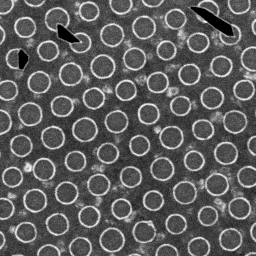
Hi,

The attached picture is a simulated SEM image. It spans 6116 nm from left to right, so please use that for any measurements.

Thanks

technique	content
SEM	a regular array of raised bodies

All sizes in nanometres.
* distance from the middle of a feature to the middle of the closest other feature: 778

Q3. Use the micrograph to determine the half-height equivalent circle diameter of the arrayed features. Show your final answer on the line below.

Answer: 498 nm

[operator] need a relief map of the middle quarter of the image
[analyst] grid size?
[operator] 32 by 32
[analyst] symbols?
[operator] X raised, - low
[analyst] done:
XXXX---XXXXXX---XXXX----------XX
XXXX---XXXXX-----------------XXX
XXXXX---XXXX----------XXX----XXX
XXXX-----------------XXXXX---XXX
XXXX----------XXX----XXXXX----XX
-------------XXXXX---XXXXX------
------XXX----XXXXX----XXX--X----
-----XXXXX---XXXXX--------------
X----XXXXX----XXX-----------XXX-
XX---XXXXX-----------------XXXX-
XX----XXX-----------XXX----XXXXX
XX-----------------XXXX----XXXX-
X----------XXXX----XXXXX----XX--
-----------XXXXX---XXXXX--------
---XXXX---XXXXXX----XXX---------
--XXXXXX---XXXXX----------------
--XXXXXX----XXX----------XXXX---
--XXXXXX----------------XXXXXX--
---XXXX----------XXX----XXXXXX--
-----------------XXXX---XXXXX---
---------XXXX----XXXX----XXXX---
---------XXXX----XXXX-----------
-XXX----XXXXXX----XX-----------X
-XXXX----XXXX-----------------XX
-XXXX-----XX----------XXXXX---XX
-XXXX-----------------XXXXX----X
--XX-----------XXXX---XXXXX-----
--------------XXXXX---XXXXX-----
-------XXXX---XXXXX----XXX------
------XXXXX----XXXX-----------X-
XXX---XXXXX-----XX----------XXXX
XXX---XXXXX----------------XXXXX